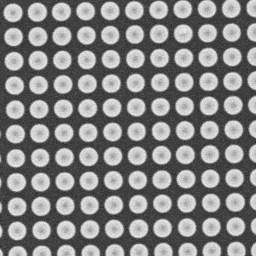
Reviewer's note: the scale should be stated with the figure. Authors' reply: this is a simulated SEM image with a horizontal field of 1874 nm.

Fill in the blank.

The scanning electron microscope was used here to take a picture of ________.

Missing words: an array of small figures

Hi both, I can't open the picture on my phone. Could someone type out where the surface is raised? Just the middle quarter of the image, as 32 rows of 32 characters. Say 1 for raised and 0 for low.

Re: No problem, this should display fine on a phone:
10001110001110000110000110000110
00000000000000000000000000000000
00000000000000000000000000000110
10001111001111001111001111001111
11001111001111001111001111001111
11001111001111001111001111001111
11001110001110000110000110000110
00000000000000000000000000000000
00000000000000000000000000000110
10001111001111001111001111001111
11001111001111001111001111001111
11001111001111001111001111001111
11001111000111000111000110000110
00000000000000000000000000000000
00000000000000000000000000000110
10000110001111000111001111001111
11001111001111001111001111001111
11001111001111001111001111001111
11001111000111000111000111000111
00000000000000000000000000000000
00000000000000000000000000000000
10000111000111000111000111001111
11001111001111001111001111101111
11001111001111001111001111001111
11001111001111000111000111000111
00000000000000000000000000000000
00000000000000000000000000000000
10000111000111000111000111000111
11001111001111001111101111101111
11001111001111001111101111101111
11001111000111000111000111000111
10000000000000000000000000000000